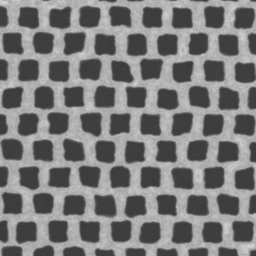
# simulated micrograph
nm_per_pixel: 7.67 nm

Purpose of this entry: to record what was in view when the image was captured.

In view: a regular array of holes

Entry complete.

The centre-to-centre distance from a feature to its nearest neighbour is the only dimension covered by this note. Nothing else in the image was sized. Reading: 0.226 microns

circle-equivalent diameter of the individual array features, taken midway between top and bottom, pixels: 22.2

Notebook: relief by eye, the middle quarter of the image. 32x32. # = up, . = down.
.###......##....###......##.....
.###.....###....###.....###.....
.###.....###.....##.....###.....
.###.....###.....###....###.....
.##############..###########...#
#########.######################
.....###.....###....####..#.###.
.....###.....###.....##.....###.
.....##......###....###.....###.
.....###.....###....###.....###.
.....###....####....###.....####
################################
.####....###....####.#######....
.###.....###.....##.....###.....
.###.....###....###.....###.....
.###.....##.....###.....###.....
.####....##......##.....###.....
#######..###..######....###...##
################################
....####....####..#####....####.
.....###.....###....###.....###.
.....###.....##.....####....###.
.....###.....##.....###.....###.
.....###.....##.....###.....###.
##.######...####....#####.#.####
####...######.##################
..##.....###....###.....###.....
.###.....##.....###.....###.....
.###.....##.....###.....###.....
.###.....###....###.....###.....
.####...####....###.....###.....
###############################.